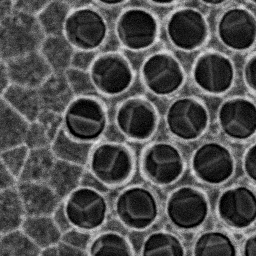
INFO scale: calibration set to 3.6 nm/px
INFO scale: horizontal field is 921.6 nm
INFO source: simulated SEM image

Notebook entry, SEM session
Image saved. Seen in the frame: a regular array of holes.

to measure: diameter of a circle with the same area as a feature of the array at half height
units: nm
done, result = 150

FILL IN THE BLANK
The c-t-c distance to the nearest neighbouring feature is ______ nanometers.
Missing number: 181